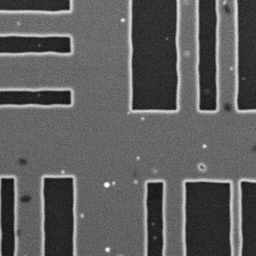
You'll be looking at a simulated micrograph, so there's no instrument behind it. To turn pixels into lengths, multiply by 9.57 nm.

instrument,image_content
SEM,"groups of lines, slits or small figures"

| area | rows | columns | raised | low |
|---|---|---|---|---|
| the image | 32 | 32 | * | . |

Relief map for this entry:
.........*******......***..***..
******.*********......***..***..
****************......***..***..
****************......***..***..
....**..********......***..***..
.........*******......***..***..
.........*******......***..***..
****************......***..***..
****************......***..***..
****************......***..***..
****************......***..***..
.........*******......***..***..
.........*******......***..***..
*****************.....***..***..
********************************
********************************
********************************
********************************
********************************
********************************
********************************
********************************
..***....***********************
..***....*********...**......*..
..***....*********...**......*..
..***....*********..***......*..
..***....*********..***......*..
..***....*********..***......*..
..***....*********...**......*..
..***....*********...**......*..
..***....*********...**......*..
..***....*********..***......*..